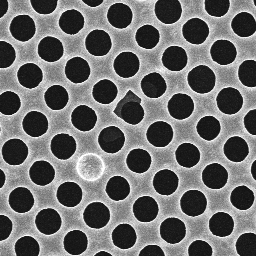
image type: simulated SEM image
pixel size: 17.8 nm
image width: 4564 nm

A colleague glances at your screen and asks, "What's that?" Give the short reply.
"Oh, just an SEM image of a regular array of holes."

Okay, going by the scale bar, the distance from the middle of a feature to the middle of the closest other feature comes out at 608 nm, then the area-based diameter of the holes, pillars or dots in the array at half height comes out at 0.466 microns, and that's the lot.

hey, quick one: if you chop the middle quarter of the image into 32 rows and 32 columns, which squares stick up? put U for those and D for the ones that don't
DDDDDDUUUUUUDDDDDDDUUUUUUDDDDDUU
DDDDDDDUUUUUUDDDDDDUUUUUUUDDDUUU
DDDDDDDUUUUUUDDDDDUUUDDDUUUUUUUD
UDDDDDUUUUUUUUUDUUUUDDDDDUUUUUUD
UUDDDUUUDDDDUUUUUUUDDDDDDDUUUUUD
UUUUUUUDDDDDDUUUUUUDDDDDDDUUUUUD
DUUUUUUDDDDDDUUUUUUDDDDDDDUUUUUU
DUUUUUUDDDDDDUUUDDUUDDDDDUUUDDUU
DUUUUUUDDDDDDUUDDDDUUUDUUUUDDDDD
DUUUUUUUDDDDUUDDDDDUUUUUUUDDDDDD
UUUUDDUUUUUUUDDDDDDUUUUUUUDDDDDD
UUDDDDDUUUUUDDDDDDDDUUUUUUDDDDDD
UUDDDDDDUUUUUDDDDDDDUUUUUUDDDDDD
UUDDDDDDUUUUUUDDDDDDUUUUUUUDDDUU
UUDDDDDDUUUUUUUDDDDUUUUDDUUUUUUU
UUDDDDDDUUUUDUUUUUUUUDDDDDDUUUUU
UUUUDDDUUDDDDDUUUUUUUDDDDDDUUUUU
DUUUUUUUUDDDDDDUUUUUDDDDDDDUUUUU
DDUUUUUUDDDDDDDUUUUUUDDDDDDUUUUU
DDDUUUUUDDDDDDDUUUUUUDDDDDDUUUUU
DDDUUUUUUDDDDDDUUUUUUUDDDDUUUDDD
DDDUUUUUUUDDDDUUUDDDUUUUUUUUDDDD
DDUUUUUUUUUUUUUUDDDDDUUUUUUUDDDD
DUUUUUUUUUUUUUUUDDDDDDUUUUUUDDDD
UUUUUUUUUUUUUUUUDDDDDDUUUUUUDDDD
UUUUUUUUUUUUUUUUDDDDDDUUUUUUUDDD
UUUUUUUUUUUUUUUUUDDDDUUUDDUUUUUU
UUUUUUUUUUUUUUUUUUUUUUUDDDDDUUUU
UUUUUUUUUUUUDDDUUUUUUUDDDDDDDUUU
DDUUUUUUUUUDDDDDUUUUUUDDDDDDDUUU
DDDDUUUUUUDDDDDDUUUUUUDDDDDDDUUU
DDDDUUUUUUDDDDDDDUUUUUUDDDDDUUUD